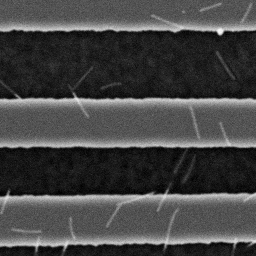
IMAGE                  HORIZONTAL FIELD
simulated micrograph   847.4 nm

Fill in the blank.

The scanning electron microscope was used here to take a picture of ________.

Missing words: lines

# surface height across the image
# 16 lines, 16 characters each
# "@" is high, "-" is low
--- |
@@@@@@@@@@@@@@@@
@@@@@@@@@@@@@@@@
----------------
----------------
----------------
----------------
@@@@@@@@@@@@@@@@
@@@@@@@@@@@@@@@@
@@@@@@@@@@@@@@@@
----------------
----------------
----------------
@@@@@@@@@@@@@@@@
@@@@@@@@@@@@@@@@
@@@@@@@@@@@@@@@@
----------------